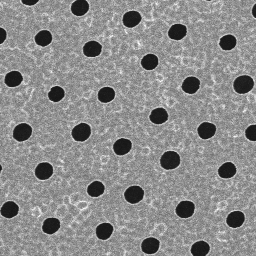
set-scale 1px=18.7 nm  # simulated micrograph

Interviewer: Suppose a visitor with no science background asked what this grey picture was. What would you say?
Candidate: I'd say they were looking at a regular array of holes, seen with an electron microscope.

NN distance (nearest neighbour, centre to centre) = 838 nanometres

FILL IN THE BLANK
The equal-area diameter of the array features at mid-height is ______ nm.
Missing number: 335